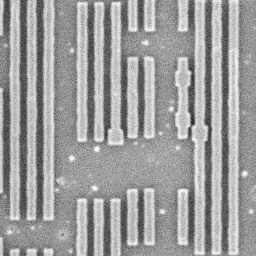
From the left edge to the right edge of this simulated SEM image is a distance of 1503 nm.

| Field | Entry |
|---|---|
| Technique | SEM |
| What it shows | wiring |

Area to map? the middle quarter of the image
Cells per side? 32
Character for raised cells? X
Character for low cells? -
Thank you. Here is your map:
---XXX--XX--XX--XX--XX-------XX-
---XXX--XX--XX--XX--XX-------XX-
----XX--XX--XX--XX--XX------XXXX
----XX--XX--XX--XX--XX------XXX-
----XX--XX--XX--XX--XX------XXX-
----XX--XX--XX--XX--XX------XXX-
----XX--XX--XX--XX--XX-------XX-
----XX--XX--XX--XX--XX-------XX-
----XX--XX--XX--XX--XX-------XX-
----XX--XX--XX--XX--XX-------XX-
----X---XX--XX--XX--XX-------XX-
---XXX--XX--XX--XX--XX-------XX-
----XX--XX--XX--XX--XX------XXX-
----XX--XX--XX--XX--XX------XXX-
---XXX--XX--XX--XX--XX------XXX-
---XXX--XX--XX--XX--XX------XXX-
---XXX--XX--XX--XX--XX-------XX-
----X---XX-XXXX-XX--XX-------XX-
----X---XX-XXXX-----------------
-----------XXXX-----------------
--------------------------------
--------------------------------
--------------------------------
--------------------------------
--------------------------------
--------------------------------
--------------------------------
--------------------------------
--------------------------------
--------------------------------
--------------------------------
--------------------XX----------